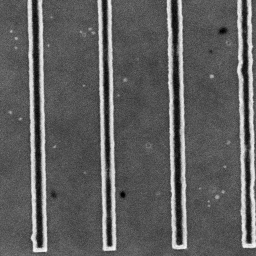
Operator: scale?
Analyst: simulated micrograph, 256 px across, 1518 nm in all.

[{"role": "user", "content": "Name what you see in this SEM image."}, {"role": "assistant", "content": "one or a few lines or trenches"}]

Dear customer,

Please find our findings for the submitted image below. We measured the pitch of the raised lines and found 0.413 microns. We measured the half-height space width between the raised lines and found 0.35 µm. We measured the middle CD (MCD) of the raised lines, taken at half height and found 10.6 pixels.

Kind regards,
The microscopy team